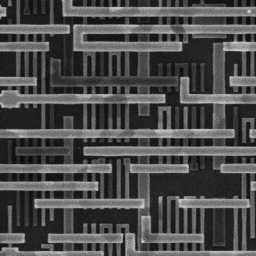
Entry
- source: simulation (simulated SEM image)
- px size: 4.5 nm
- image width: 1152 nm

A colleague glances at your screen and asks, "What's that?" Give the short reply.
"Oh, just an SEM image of wiring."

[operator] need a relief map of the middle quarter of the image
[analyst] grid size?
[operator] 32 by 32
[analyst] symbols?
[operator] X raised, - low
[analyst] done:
--------------------------------
--------------------------------
--------------------------------
XXXXXXXXXXXXXXXXXXXXXXXXXXXX-XX-
XXXXXXXXXXXXXXXXXXXXXXXXXXXX-XX-
-----------------------------XX-
-----------------------------XX-
-----------------------------XXX
XXXXXXXXXXXXXXXXXXXXXXXXX----XXX
XXXXXXXXXXXXXXXXXXXXXXXXX----XXX
--------------------------------
--------------------------------
--------------------------------
--------------------------------
--------------------------------
--------------------------------
XXXXXXXXXXXXXXXXXXXXXXXXXXXXXXXX
XXXXXXXXXXXXXXXXXXXXXXXXXXXXXXXX
XXXXXX------XXXXX----------XXXXX
--------------------------------
--------------------------------
X----XXXXXXXXXXXXXXXXXXXXXXXXXXX
X----XXXXXXXXXXXXXXXXXXXXXXXXXXX
--------------------------------
--------------------------------
XXXXXXXXXXXX-----XXXXXXXXXXXXXX-
XXXXXXXXXXXX-----XXXXXXXXXXXXXX-
--------------------------------
--------------------------------
XXXXXXXX------------------------
XXXXXXXX------------------------
XXXXXXXX------------------------